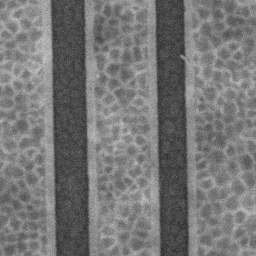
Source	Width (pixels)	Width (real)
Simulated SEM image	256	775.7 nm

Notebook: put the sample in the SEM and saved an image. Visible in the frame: one or a few lines or trenches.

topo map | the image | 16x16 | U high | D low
UUUDDDUUUDDDUUUU
UUUDDDUUUDDDUUUU
UUUDDDUUUDDDUUUU
UUUDDDUUUDDDUUUU
UUUDDDUUUDDDUUUU
UUUDDDUUUUDDUUUU
UUUDDDUUUUDDUUUU
UUUDDDUUUUDDUUUU
UUUDDDUUUUDDUUUU
UUUDDDUUUUDDUUUU
UUUDDDUUUUDDUUUU
UUUDDDUUUUDDUUUU
UUUDDDUUUUDDUUUU
UUUDDDUUUUDDUUUU
UUUDDDUUUUDDUUUU
UUUDDDUUUUDDUUUU